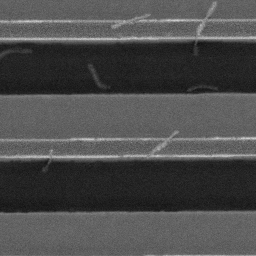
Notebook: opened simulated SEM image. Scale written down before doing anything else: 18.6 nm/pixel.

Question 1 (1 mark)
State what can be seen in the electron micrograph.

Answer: lines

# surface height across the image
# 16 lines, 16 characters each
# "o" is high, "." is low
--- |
oooooooooooooooo
oooooooooooooooo
................
................
................
................
oooooooooooooooo
oooooooooooooooo
oooooooooooooooo
oooooooooooooooo
................
................
................
oooooooooooooooo
oooooooooooooooo
oooooooooooooooo